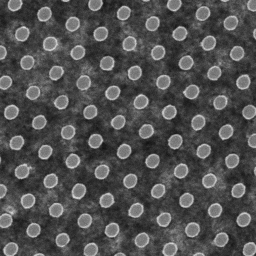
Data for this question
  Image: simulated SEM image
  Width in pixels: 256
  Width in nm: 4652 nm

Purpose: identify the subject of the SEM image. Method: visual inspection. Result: a regular array of raised bodies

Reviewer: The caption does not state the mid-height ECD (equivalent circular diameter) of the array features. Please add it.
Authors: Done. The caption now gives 254 nanometres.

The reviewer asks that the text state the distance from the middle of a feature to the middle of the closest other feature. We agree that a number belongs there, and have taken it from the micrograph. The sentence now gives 535 nanometers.